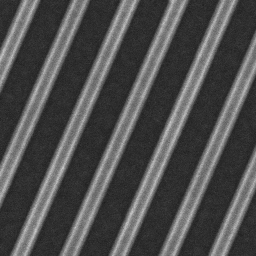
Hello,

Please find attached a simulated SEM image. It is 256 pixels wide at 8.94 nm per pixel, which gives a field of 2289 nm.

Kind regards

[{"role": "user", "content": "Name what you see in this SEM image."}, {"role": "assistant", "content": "parallel lines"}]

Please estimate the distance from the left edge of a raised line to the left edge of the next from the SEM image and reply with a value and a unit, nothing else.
406 nanometers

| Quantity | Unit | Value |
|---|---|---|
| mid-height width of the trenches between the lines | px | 31.4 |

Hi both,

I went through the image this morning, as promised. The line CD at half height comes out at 0.121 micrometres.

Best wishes